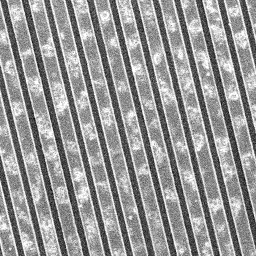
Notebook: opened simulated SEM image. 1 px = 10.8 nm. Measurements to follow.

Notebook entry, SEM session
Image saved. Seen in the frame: parallel lines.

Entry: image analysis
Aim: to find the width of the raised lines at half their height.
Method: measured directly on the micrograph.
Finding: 156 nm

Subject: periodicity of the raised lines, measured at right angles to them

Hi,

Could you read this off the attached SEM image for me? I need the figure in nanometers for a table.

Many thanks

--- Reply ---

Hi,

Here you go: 228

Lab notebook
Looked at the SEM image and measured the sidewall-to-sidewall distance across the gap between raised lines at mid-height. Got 77.5 nanometres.